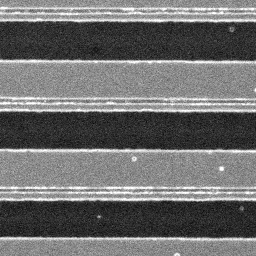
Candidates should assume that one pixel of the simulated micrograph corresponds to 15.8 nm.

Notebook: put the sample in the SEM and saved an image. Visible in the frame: lines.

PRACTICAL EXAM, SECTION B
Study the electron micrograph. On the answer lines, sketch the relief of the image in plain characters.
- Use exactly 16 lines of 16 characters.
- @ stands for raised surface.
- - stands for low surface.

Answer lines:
@@@@@@@@@@@@@@@@
----------------
----------------
----------------
@@@@@@@@@@@@@@@@
@@@@@@@@@@@@@@@@
@@@@@@@@@@@@@@@@
----------------
----------------
@@@@@@@@@@@@@@@@
@@@@@@@@@@@@@@@@
@@@@@@@@@@@@@@@@
----------------
----------------
----------------
@@@@@@@@@@@@@@@@